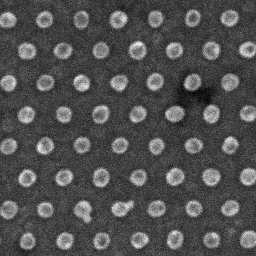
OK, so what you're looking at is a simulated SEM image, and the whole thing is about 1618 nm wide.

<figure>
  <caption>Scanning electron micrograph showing a regular array of raised bodies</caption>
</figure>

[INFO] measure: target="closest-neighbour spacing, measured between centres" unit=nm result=228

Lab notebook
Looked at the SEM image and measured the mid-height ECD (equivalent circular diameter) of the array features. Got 97.2 nanometers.